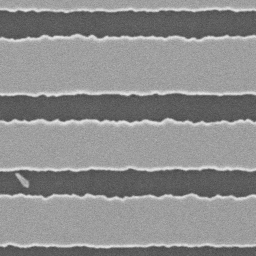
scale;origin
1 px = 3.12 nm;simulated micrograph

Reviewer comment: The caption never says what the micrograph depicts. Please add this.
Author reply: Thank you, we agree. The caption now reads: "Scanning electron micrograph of lines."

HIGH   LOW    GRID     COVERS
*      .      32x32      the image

********************************
........*.......................
................................
................................
.....*...*.....................*
********************************
********************************
********************************
********************************
********************************
********************************
********************************
................................
................................
................................
********************************
********************************
********************************
********************************
********************************
********************************
................................
................................
................................
***....*****...........**......*
********************************
********************************
********************************
********************************
********************************
********************************
................................